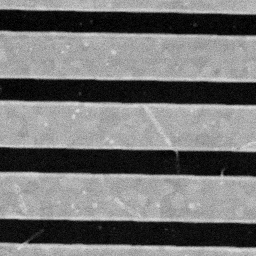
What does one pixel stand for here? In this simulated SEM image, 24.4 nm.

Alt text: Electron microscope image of lines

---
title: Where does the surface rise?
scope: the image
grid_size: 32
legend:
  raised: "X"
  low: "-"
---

XXXXXXXXXXXXXXXXXXXXXXXXXXXXXXXX
----------------------XXXXXXXXXX
--------------------------------
--------------------------------
XXXXXXXXXXXXXXXXXXXXXXXXXXXXXXXX
XXXXXXXXXXXXXXXXXXXXXXXXXXXXXXXX
XXXXXXXXXXXXXXXXXXXXXXXXXXXXXXXX
XXXXXXXXXXXXXXXXXXXXXXXXXXXXXXXX
XXXXXXXXXXXXXXXXXXXXXXXXXXXXXXXX
XXXXXXXXXXXXXXXXXXXXXXXXXXXXXXXX
--------------------------------
--------------------------------
--------------------------------
XXXXXXXXXXXXXXXXXXXXXXXXXXXXXXXX
XXXXXXXXXXXXXXXXXXXXXXXXXXXXXXXX
XXXXXXXXXXXXXXXXXXXXXXXXXXXXXXXX
XXXXXXXXXXXXXXXXXXXXXXXXXXXXXXXX
XXXXXXXXXXXXXXXXXXXXXXXXXXXXXXXX
---------XXXXXXXXXXXXXXXXXXXXXXX
--------------------------------
--------------------------------
--------------------------------
XXXXXXXXXXXXXXXXXXXXXXXXXXXXXXXX
XXXXXXXXXXXXXXXXXXXXXXXXXXXXXXXX
XXXXXXXXXXXXXXXXXXXXXXXXXXXXXXXX
XXXXXXXXXXXXXXXXXXXXXXXXXXXXXXXX
XXXXXXXXXXXXXXXXXXXXXXXXXXXXXXXX
---------XXXXXXXXXXXXXXXXXXXXXXX
--------------------------------
--------------------------------
XXXX----------------------------
XXXXXXXXXXXXXXXXXXXXXXXXXXXXXXXX